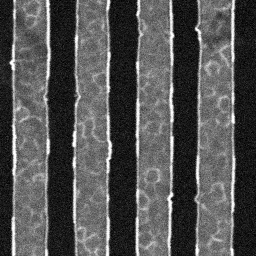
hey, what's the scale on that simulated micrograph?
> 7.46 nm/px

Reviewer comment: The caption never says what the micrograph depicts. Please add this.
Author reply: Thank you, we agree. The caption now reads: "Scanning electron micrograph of one or a few lines or trenches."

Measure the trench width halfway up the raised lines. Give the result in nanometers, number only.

237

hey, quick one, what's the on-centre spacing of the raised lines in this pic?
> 61.6 px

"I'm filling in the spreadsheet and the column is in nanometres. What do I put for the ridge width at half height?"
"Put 225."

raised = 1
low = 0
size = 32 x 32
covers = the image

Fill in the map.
11000011110001111010011110000111
11000011110001111000011110010111
11000011110001111000111110000111
11000011110001111000011110000111
11000011110000111100011110000111
11000011110000111000011110000111
11001011110001111000011110001111
11000011110001111000011110000111
11000011110001111000011110000111
11000011110001111000011110000111
11000011110001111000011110000111
11000011110001111000011110000111
11000011110001111000011110001111
11000011110001111000011110001111
11000011110000111000011110000111
11000011110001111000011110000111
11000011100001111000011110000111
11000011100101111000011110000111
11000011100000111000011110000111
11000011110000111000011110000111
11000011100001111000011110000111
11000011100001111000011110000111
11000011110001111000011110000111
11001111100001111000011110000111
11000011100001111000011110000111
11000011100001111000011110000111
11000011100001111000011110000111
11000011100001111100011110000111
11000011100001111000011110000111
11000011110001111000011110000111
11000011110001111000011110000111
11000111110001111000011110000111